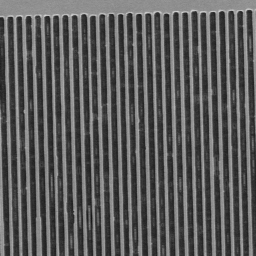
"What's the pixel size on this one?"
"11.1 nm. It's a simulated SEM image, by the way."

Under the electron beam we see parallel lines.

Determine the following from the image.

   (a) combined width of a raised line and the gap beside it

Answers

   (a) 0.102 µm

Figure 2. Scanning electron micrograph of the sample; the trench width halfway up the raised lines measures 66.8 nm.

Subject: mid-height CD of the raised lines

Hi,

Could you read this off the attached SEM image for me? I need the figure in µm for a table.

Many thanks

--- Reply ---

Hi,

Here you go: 0.0376